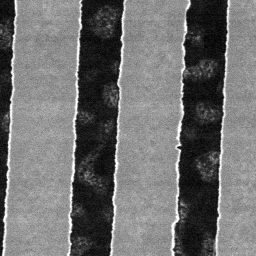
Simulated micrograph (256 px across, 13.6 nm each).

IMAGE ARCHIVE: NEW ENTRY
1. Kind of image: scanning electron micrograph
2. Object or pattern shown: one or a few lines or trenches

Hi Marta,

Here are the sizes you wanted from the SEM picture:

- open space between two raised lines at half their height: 567 nanometers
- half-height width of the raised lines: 64.7 pixels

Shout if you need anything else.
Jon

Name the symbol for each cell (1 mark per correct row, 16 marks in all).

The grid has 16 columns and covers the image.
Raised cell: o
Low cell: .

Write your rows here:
.oooo...oooo..oo
.oooo...oooo..oo
.oooo...oooo..oo
.oooo...oooo..oo
.oooo..oooo...oo
.oooo..oooo...oo
.oooo..oooo...oo
.oooo..oooo...oo
.oooo..oooo...oo
.oooo..oooo...oo
.oooo..oooo...oo
ooooo..oooo...oo
oooo...oooo...oo
oooo...oooo...oo
oooo...oooo...oo
oooo...oooo...oo